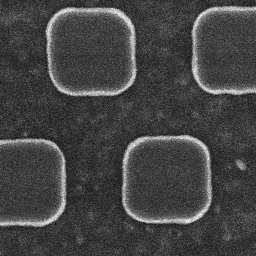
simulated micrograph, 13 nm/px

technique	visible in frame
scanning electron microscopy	raised bodies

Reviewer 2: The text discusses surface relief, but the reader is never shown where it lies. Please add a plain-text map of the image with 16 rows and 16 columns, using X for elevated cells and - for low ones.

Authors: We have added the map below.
----------------
---XXXXX----XXXX
---XXXXX----XXXX
---XXXXX----XXXX
---XXXXX----XXXX
----XXXX-----XXX
----------------
----------------
----------------
XXXX----XXXXX---
XXXX----XXXXX---
XXXX----XXXXX---
XXXX----XXXXX---
XXXX----XXXX----
----------------
----------------